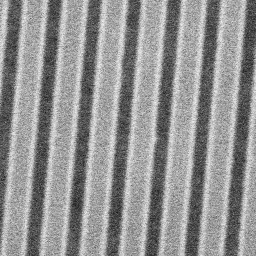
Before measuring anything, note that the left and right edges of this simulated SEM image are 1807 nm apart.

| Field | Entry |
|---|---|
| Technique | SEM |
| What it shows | parallel lines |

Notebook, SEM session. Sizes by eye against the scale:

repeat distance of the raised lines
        278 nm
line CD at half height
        146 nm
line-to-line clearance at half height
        0.134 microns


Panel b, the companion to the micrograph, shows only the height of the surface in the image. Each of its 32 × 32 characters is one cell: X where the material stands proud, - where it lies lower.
X--XXX--XXX--XXX--XXX--XXX--XX--
X--XXX--XXX--XXX--XX---XX---XX--
X--XXX--XX---XX---XX---XX---XX--
---XX---XX---XX---XX---XX---XX--
---XX---XX---XX---XX---XX--XXX--
---XX---XX---XX--XXX--XXX--XXX--
---XX---XX--XXX--XXX--XXX--XXX--
---XX--XXX--XXX--XXX--XXX--XXX--
--XXX--XXX--XXX--XXX--XXX--XXX--
--XXX--XXX--XXX--XXX--XXX--XXX--
--XXX--XXX--XXX--XXX--XXX--XXX--
--XXX--XXX--XXX--XXX--XXX--XX---
--XXX--XXX--XXX--XX---XX---XX---
--XXX--XXX--XX---XX---XX---XX---
--XX---XX---XX---XX---XX---XX---
--XX---XX---XX---XX---XX---XX--X
--XX---XX---XX---XX--XXX--XXX--X
--XX--XXX---XX--XXX--XXX--XXX--X
--XX--XXX--XXX--XXX--XXX--XXX--X
-XXX--XXX--XXX--XXX--XXX--XXX--X
-XXX--XXX--XXX--XXX--XXX--XXX--X
-XXX--XXX--XXX--XXX--XXX--XXX--X
-XXX--XXX--XXX--XXX--XXX--XXX--X
-XXX--XXX--XXX--XX---XX---XX---X
-XXX--XXX--XX---XX---XX---XX---X
-XX---XX---XX---XX---XX---XX---X
-XX---XX---XX---XX---XX---XX--XX
-XX---XX---XX---XX--XXX--XXX--XX
-XX---XX---XX---XX--XXX--XXX--XX
-XX--XXX--XXX--XXX--XXX--XXX--XX
XXX--XXX--XXX--XXX--XXX--XXX--XX
XXX--XXX--XXX--XXX--XXX--XXX--XX